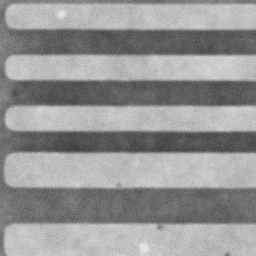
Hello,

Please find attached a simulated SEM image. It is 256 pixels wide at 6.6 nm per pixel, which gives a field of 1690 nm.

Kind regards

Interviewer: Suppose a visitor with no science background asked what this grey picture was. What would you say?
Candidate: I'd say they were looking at groups of lines, slits or small figures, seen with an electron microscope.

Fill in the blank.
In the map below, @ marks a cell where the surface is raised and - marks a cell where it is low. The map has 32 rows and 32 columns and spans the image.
--------------------------------
-@@@@@@@@@@@@@@@@@@@@@@@@@@@@@@@
-@@@@@@@@@@@@@@@@@@@@@@@@@@@@@@@
--@@@@@@@@@@@@@@@@@@@@@@@@@@@@@@
--------------------------------
--------------------------------
--------------------------------
-@@@@@@@@@@@@@@@@@@@@@@@@@@@@@@@
-@@@@@@@@@@@@@@@@@@@@@@@@@@@@@@@
-@@@@@@@@@@@@@@@@@@@@@@@@@@@@@@@
--------------------------------
--------------------------------
--------------------------------
-@@@@@@@@@@@@@@@@@@@@@@@@@@@@@@@
-@@@@@@@@@@@@@@@@@@@@@@@@@@@@@@@
-@@@@@@@@@@@@@@@@@@@@@@@@@@@@@@@
--------------------------------
--------------------------------
--------------------------------
-@@@@@@@@@@@@@@@@@@@@@@@@@@@@@@@
-@@@@@@@@@@@@@@@@@@@@@@@@@@@@@@@
-@@@@@@@@@@@@@@@@@@@@@@@@@@@@@@@
-@@@@@@@@@@@@@@@@@@@@@@@@@@@@@@@
--------------------------------
--------------------------------
--------------------------------
--------------------------------
--------------------------------
-@@@@@@@@@@@@@@@@@@@@@@@@@@@@@@@
-@@@@@@@@@@@@@@@@@@@@@@@@@@@@@@@
-@@@@@@@@@@@@@@@@@@@@@@@@@@@@@@@
-@@@@@@@@@@@@@@@@@@@@@@@@@@@@@@@